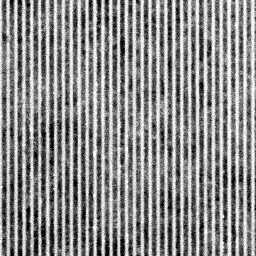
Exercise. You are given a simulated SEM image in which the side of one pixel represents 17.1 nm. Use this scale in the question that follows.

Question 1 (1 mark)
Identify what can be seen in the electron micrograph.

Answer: parallel lines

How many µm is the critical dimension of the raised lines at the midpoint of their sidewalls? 0.047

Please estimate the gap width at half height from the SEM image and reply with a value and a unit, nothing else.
93.9 nm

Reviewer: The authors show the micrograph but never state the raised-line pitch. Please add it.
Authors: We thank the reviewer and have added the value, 135 nm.